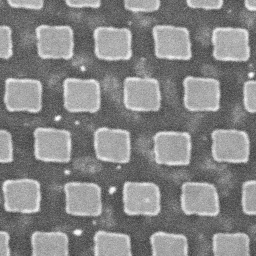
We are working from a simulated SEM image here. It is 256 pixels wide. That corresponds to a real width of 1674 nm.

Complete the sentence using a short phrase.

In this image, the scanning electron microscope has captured a regular array of raised bodies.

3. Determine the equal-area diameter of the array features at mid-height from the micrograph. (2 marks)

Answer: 237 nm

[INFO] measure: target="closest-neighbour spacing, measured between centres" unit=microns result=0.38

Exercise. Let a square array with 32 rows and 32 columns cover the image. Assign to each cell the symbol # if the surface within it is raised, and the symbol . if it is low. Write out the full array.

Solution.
.####....###....####....####...#
................................
................................
#....####..........###..........
#....####...####...#####...####.
#....####...####....####...####.
#....####...####....####...####.
.............................##.
................................
................................
.####...####....####...####....#
.####...####....####...####....#
.####...####....####...####....#
.####...####....####...####....#
................................
................................
#....###....####...........###..
#...#####...####...#####...####.
#...#####...####...#####...####.
#....####...####....####...####.
................................
................................
................................
.####...####....####...####...##
.####...#####...####...####...##
.####...#####...####...####...##
.........###....####...####....#
................................
................................
#...####....####...###.....####.
#...####....####...####....####.
#...####....####...####....####.